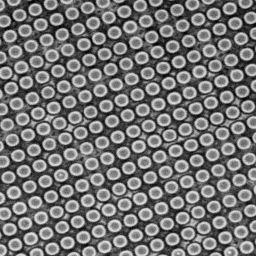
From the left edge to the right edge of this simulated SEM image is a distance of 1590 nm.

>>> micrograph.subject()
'a regular array of raised bodies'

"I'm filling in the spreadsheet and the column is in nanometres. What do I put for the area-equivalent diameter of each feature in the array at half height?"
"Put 77.5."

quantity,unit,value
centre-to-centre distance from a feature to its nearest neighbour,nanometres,101